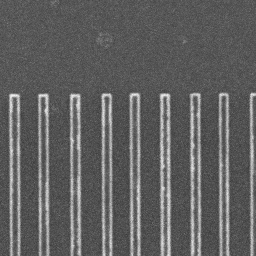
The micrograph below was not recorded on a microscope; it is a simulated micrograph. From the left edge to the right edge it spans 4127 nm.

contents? parallel lines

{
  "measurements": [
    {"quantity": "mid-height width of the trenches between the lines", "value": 359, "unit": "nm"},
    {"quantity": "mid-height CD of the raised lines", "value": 0.125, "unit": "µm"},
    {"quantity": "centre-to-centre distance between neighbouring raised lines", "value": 482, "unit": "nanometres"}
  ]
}